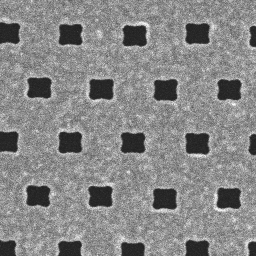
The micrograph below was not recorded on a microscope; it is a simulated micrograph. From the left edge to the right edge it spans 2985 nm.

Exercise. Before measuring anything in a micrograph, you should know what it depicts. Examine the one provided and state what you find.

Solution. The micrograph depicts a regular array of holes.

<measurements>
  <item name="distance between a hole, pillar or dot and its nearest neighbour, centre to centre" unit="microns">0.721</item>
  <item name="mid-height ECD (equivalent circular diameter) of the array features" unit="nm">288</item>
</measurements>